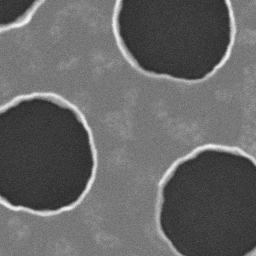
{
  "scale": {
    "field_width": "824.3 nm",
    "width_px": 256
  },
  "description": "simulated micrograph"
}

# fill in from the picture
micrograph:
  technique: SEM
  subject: holes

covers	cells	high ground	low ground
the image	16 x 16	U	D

DDUUUUUUDDDDDDUU
DUUUUUUDDDDDDDUU
UUUUUUUUDDDDDDUU
UUUUUUUUDDDDDDUU
UUUUUUUUUDDDDUUU
UUUUUUUUUUUUUUUU
UDDDUUUUUUUUUUUU
DDDDDUUUUUUUUUUU
DDDDDDUUUUUUUUUU
DDDDDDUUUUUUUDUU
DDDDDDUUUUUDDDDD
DDDDDUUUUUDDDDDD
DDDDDUUUUUDDDDDD
UUUUUUUUUUDDDDDD
UUUUUUUUUUDDDDDD
UUUUUUUUUUUDDDDD